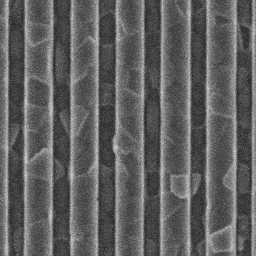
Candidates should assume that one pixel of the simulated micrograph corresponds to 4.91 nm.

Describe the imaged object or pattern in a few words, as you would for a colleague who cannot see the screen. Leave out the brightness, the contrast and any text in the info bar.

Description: parallel lines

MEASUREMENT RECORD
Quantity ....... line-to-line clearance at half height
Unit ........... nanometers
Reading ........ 83.4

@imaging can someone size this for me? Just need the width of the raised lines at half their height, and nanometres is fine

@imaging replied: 137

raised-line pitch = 224 nm